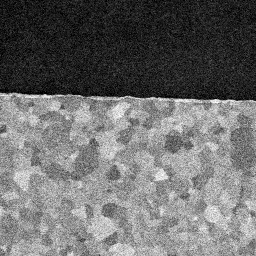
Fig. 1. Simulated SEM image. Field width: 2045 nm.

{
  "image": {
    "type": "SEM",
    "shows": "one or a few lines or trenches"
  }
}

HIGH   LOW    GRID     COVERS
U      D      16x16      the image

DDDDDDDDDDDDDDDD
DDDDDDDDDDDDDDDD
DDDDDDDDDDDDDDDD
DDDDDDDDDDDDDDDD
DDDDDDDDDDDDDDDD
DDDDDDDDDDDDDDDD
UUUUUUUUUUUUUUUU
UUUUUUUUUUUUUUUU
UUUUUUUUUUUUUUUU
UUUUUUUUUUUUUUUU
UUUUUUUUUUUUUUUU
UUUUUUUUUUUUUUUU
UUUUUUUUUUUUUUUU
UUUUUUUUUUUUUUUU
UUUUUUUUUUUUUUUU
UUUUUUUUUUUUUUUU